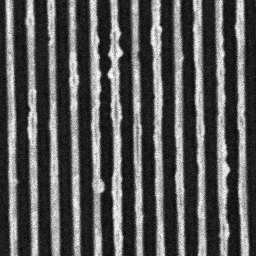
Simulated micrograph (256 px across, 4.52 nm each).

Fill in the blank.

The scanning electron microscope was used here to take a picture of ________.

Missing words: parallel lines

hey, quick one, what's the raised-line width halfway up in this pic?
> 39 nm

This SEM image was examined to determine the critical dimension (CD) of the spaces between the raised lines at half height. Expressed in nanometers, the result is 54.8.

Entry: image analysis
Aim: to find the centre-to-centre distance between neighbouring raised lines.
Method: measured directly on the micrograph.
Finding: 94.7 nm